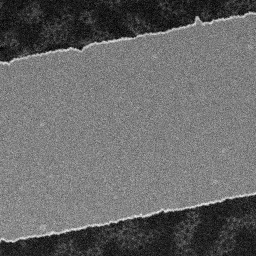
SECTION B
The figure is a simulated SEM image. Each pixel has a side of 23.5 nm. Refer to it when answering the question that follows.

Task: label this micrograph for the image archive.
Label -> one or a few lines or trenches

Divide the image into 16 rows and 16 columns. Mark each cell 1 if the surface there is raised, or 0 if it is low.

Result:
0000000000000000
0000000000001111
0000000111111111
0011111111111111
1111111111111111
1111111111111111
1111111111111111
1111111111111111
1111111111111111
1111111111111111
1111111111111111
1111111111111111
1111111111111100
1111111110000000
1111000000000000
0000000000000000